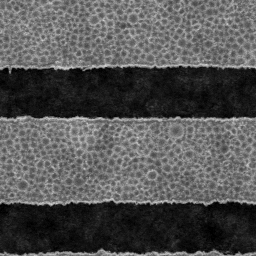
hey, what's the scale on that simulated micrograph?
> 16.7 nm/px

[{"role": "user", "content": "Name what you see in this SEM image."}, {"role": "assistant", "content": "one or a few lines or trenches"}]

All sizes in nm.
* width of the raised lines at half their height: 1390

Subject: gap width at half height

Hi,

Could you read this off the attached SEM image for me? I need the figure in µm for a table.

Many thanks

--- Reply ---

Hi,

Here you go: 0.881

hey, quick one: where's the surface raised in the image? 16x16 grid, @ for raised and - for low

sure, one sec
@@@@@@@@@@@@@@@@
@@@@@@@@@@@@@@@@
@@@@@@@@@@@@@@@@
@@@@@@@@@@@@@@@@
----------------
----------------
----------------
@@@@@@@@@@@@@@@@
@@@@@@@@@@@@@@@@
@@@@@@@@@@@@@@@@
@@@@@@@@@@@@@@@@
@@@@@@@@@@@@@@@@
@@@@@@@@@@@@@@@@
----------------
----------------
----------------